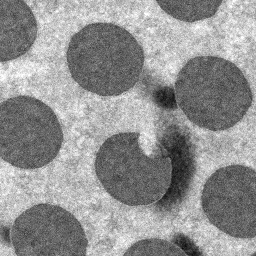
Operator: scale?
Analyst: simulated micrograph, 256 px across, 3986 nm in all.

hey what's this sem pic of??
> raised bodies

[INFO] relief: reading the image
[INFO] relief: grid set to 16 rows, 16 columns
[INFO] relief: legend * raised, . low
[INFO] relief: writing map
**........****..
**....*.........
**..*****.......
*...*****.......
....*****..****.
.....***...*****
***........*****
****........***.
****...**.......
****..***.......
.*....*****...**
......*****..***
.......***...***
.****........***
.****.........**
.****...***.....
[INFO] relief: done